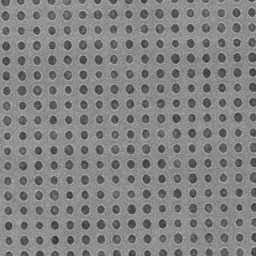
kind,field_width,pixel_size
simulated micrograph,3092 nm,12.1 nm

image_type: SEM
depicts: a regular array of holes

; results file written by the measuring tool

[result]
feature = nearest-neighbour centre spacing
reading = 178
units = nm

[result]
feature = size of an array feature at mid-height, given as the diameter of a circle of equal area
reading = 0.111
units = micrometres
